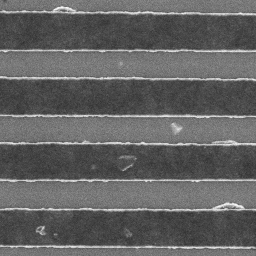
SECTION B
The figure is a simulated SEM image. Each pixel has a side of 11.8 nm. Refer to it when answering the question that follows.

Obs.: lines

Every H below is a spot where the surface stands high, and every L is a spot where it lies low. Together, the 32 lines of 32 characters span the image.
LLLLLLLLLLLLLLLLLLLLLLLLLLLLLLLL
HLHHHHLLLLLLLLLLLLLLLLLLLLLLLLLL
HHHHHHHHHHHHHHHHHHHHHHHHHHHHHHHH
HHHHHHHHHHHHHHHHHHHHHHHHHHHHHHHH
HHHHHHHHHHHHHHHHHHHHHHHHHHHHHHHH
HHHHHHHHHHHHHHHHHHHHHHHHHHHHHHHH
LLLLLLLLLLLLLLLLLLLLLLLLLLLLLLLL
LLLLLLLLLLLLLLLLLLLLLLLLLLLLLLLL
LLLLLLLLLLLLLLLLLLLLLLLLLLLLLLLL
LLLLLLLLLLLLLLLLLLLLLLLLLLLLLLLL
HHHHHHHHHHHHHHHHHHHHHHHHHHHHHHHH
HHHHHHHHHHHHHHHHHHHHHHHHHHHHHHHH
HHHHHHHHHHHHHHHHHHHHHHHHHHHHHHHH
HHHHHHHHHHHHHHHHHHHHHHHHHHHHHHHH
LLHHLHHLHHHLHHHHHHHHHHHHHHHHHHHH
LLLLLLLLLLLLLLLLLLLLLLLLLLLLLLLL
LLLLLLLLLLLLLLLLLLLLLLLLLLLLLLLL
LLLLLLLLLLLLLLLLLLLLLLLLLLLLLLLL
HHHHHHHHHHHHHHHHHHHHHHHHHHHHHHHH
HHHHHHHHHHHHHHHHHHHHHHHHHHHHHHHH
HHHHHHHHHHHHHHHHHHHHHHHHHHHHHHHH
HHHHHHHHHHHHHHHHHHHHHHHHHHHHHHHH
HHHHHHHHHHHHHHHHHHHHHHHHHHHHHHHH
LLLLLLLLLLLLLLLLLLLLLLLLLLLLLLLL
LLLLLLLLLLLLLLLLLLLLLLLLLLLLLLLL
LLLLLLLLLLLLLLLLLLLLLLLLLLLLLLLL
HHHHHHHHHHHHHHHHHHHHHHHHHHHHHHHH
HHHHHHHHHHHHHHHHHHHHHHHHHHHHHHHH
HHHHHHHHHHHHHHHHHHHHHHHHHHHHHHHH
HHHHHHHHHHHHHHHHHHHHHHHHHHHHHHHH
HHHHHHHHHHHHHHHHHHHHHHHHHHHHHHHH
LLLLLLLLLLLLLLLLLLLLLLLLLLLLLLLL